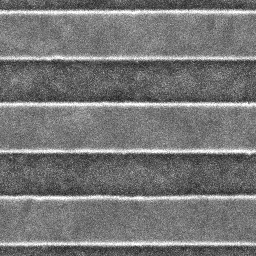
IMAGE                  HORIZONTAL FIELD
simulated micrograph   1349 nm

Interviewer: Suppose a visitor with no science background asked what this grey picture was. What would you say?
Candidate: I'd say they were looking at one or a few lines or trenches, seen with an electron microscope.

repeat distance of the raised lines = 488 nanometres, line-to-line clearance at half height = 44.8 px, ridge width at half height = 0.249 micrometres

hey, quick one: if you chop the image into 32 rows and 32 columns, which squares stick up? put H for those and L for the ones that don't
LLLLLLLLLLLLLLLLLLLLLLLLLLLLLLLL
LLLLLLLLLLLLLLLLLLLLLLLLLLLLLLLL
HHHHHHHHHHHHHHHHHHHHHHHHHHHHHHHH
HHHHHHHHHHHHHHHHHHHHHHHHHHHHHHHH
HHHHHHHHHHHHHHHHHHHHHHHHHHHHHHHH
HHHHHHHHHHHHHHHHHHHHHHHHHHHHHHHH
HHHHHHHHHHHHHHHHHHHHHHHHHHHHHHHH
LLLLLLLLLLLLLLLLLLLLLLLLLLLLLLLL
LLLLLLLLLLLLLLLLLLLLLLLLLLLLLLLL
LLLLLLLLLLLLLLLLLLLLLLLLLLLLLLLL
LLLLLLLLLLLLLLLLLLLLLLLLLLLLLLLL
LLLLLLLLLLLLLLLLLLLLLLLLLLLLLLLL
LLLLLLLLLLLLLLLLLLLLLLLLLLLLLLLL
HHHHHHHHHHHHHHHHHHHHHHHHHHHHHHHH
HHHHHHHHHHHHHHHHHHHHHHHHHHHHHHHH
HHHHHHHHHHHHHHHHHHHHHHHHHHHHHHHH
HHHHHHHHHHHHHHHHHHHHHHHHHHHHHHHH
HHHHHHHHHHHHHHHHHHHHHHHHHHHHHHHH
HHHHHHHHHHHHHHHHHHHHHHHHHHHHHHHH
LLLLLLLLLLLLLLLLLLLLLLLLLLLLLLLL
LLLLLLLLLLLLLLLLLLLLLLLLLLLLLLLL
LLLLLLLLLLLLLLLLLLLLLLLLLLLLLLLL
LLLLLLLLLLLLLLLLLLLLLLLLLLLLLLLL
LLLLLLLLLLLLLLLLLLLLLLLLLLLLLLLL
LLLLLLLLLLLLLLLLLLLLLLLLLLLLLLLL
HHHHHHHHHHHHHHHHHHHHHHHHHHHHHHHH
HHHHHHHHHHHHHHHHHHHHHHHHHHHHHHHH
HHHHHHHHHHHHHHHHHHHHHHHHHHHHHHHH
HHHHHHHHHHHHHHHHHHHHHHHHHHHHHHHH
HHHHHHHHHHHHHHHHHHHHHHHHHHHHHHHH
LLLLLLLLLLLLLLLLLHLLLLLLLLLLLLLL
LLLLLLLLLLLLLLLLLLLLLLLLLLLLLLLL